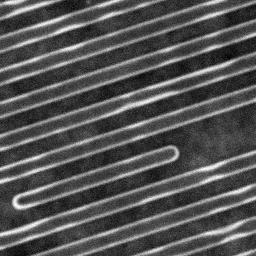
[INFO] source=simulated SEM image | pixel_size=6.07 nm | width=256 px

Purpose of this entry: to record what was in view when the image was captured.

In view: groups of lines, slits or small figures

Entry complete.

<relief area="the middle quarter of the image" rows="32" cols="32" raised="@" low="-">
------------@@@@@@@@@@@@--------
---------@@@@@@@@@@@@-----------
------@@@@@@@@@@@@--------------
---@@@@@@@@@@@@--------------@@@
@@@@@@@@@@@@--------------@@@@@@
@@@@@@@@@--------------@@@@@@@@@
@@@@@--------------@@@@@@@@@@@@-
@@@-------------@@@@@@@@@@@-----
-------------@@@@@@@@@@---------
----------@@@@@@@@@@@-----------
------@@@@@@@@@@@---------------
----@@@@@@@@@@@--------------@@@
@@@@@@@@@@@@--------------@@@@@@
@@@@@@@@@--------------@@@@@@@@@
@@@@@@--------------@@@@@@@@@@@@
@@@--------------@@@@@@@@@@@@---
-------------@@@@@@@@@@@@-------
-----------@@@@@@@@@@@----------
-------@@@@@@@@@@@@-------------
-----@@@@@@@@@@@----------------
-@@@@@@@@@@@@-------------------
@@@@@@@@@@-------------@@@@@----
@@@@@@@-------------@@@@@@@@----
@@@@-------------@@@@@@@@@@@----
@-------------@@@@@@@@@@@@------
-----------@@@@@@@@@@@@---------
--------@@@@@@@@@@@@------------
-----@@@@@@@@@@@@-------------@@
--@@@@@@@@@@@--------------@@@@@
@@@@@@@@@@@-------------@@@@@@@@
@@@@@@@--------------@@@@@@@@@@@
@@@@@-------------@@@@@@@@@@@@--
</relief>